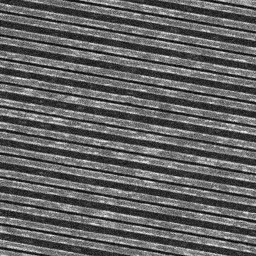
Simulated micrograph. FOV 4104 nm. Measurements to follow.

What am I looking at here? parallel lines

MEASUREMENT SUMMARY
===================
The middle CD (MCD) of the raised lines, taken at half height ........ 96.7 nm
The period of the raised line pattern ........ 0.186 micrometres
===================